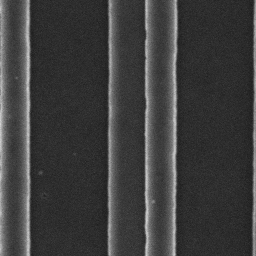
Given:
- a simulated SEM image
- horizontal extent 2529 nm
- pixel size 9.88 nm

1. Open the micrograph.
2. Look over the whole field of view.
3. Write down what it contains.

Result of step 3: lines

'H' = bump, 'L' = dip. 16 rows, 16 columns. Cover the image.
HHLLLLLHHHHLLLLL
HHLLLLLHHHHLLLLL
HHLLLLLHHHHLLLLL
HHLLLLLHHHHLLLLL
HHLLLLLHHHHLLLLL
HHLLLLLHHHHLLLLL
HHLLLLLHHHHLLLLL
HHLLLLLHHHHLLLLL
HHLLLLLHHHHLLLLL
HHLLLLLHHHHLLLLL
HHLLLLLHHHHLLLLL
HHLLLLLHHHHLLLLL
HHLLLLLHHHHLLLLL
HHLLLLLHHHHLLLLL
HHLLLLLHHHHLLLLL
HHLLLLLHHHHLLLLL